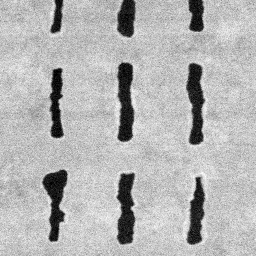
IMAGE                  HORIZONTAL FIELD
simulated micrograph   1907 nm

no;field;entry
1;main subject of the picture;holes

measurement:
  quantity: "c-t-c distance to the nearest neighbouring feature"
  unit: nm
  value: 525